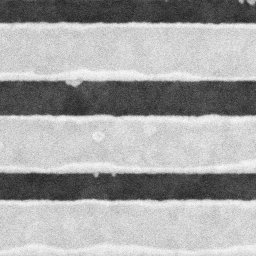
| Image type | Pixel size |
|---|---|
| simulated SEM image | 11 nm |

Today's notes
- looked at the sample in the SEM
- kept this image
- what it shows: lines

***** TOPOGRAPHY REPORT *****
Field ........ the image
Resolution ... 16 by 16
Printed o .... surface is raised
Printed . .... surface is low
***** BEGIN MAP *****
................
ooooooooooooo.oo
oooooooooooooooo
oooooooooooooooo
oooooooooooooooo
................
................
oooooooooooooooo
oooooooooooooooo
oooooooooooooooo
oooooooooooooooo
................
.....o..........
oooooooooooooooo
oooooooooooooooo
oooooooooooooooo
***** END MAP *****